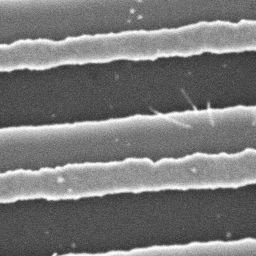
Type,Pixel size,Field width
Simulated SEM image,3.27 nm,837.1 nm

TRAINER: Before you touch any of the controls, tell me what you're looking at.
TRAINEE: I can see lines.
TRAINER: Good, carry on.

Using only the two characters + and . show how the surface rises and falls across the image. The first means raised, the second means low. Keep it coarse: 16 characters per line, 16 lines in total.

++++++++++++++++
++++++++++++++++
++++++++++++++++
++++++++++......
................
................
................
.......+++++++++
++++++++++++++++
++++++++++++++++
++++++++++++++++
++++++++++++++++
+...............
................
................
..........++++++